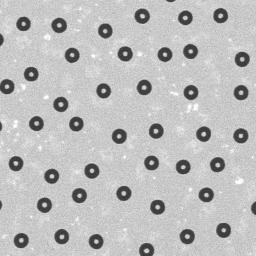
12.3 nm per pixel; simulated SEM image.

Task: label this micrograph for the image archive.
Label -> a regular array of ring-shaped grooves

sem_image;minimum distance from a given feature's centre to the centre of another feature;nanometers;408